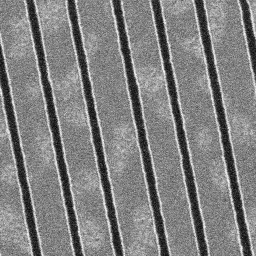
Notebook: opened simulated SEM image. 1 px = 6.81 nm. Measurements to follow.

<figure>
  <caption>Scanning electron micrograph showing parallel lines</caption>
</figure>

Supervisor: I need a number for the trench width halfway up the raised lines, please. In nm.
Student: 206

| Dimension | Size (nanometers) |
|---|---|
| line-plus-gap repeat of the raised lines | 282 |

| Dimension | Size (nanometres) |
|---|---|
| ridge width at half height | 72.7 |